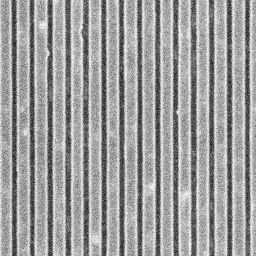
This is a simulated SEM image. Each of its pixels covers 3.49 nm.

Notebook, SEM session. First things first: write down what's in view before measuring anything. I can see parallel lines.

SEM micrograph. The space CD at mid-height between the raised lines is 20.9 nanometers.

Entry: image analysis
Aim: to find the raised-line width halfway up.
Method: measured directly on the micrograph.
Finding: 41.4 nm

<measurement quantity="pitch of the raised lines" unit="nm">62.8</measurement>